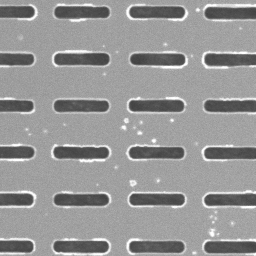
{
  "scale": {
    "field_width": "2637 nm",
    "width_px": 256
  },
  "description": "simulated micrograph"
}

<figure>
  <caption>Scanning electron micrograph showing a regular array of holes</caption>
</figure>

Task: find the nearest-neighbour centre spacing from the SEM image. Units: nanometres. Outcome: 481